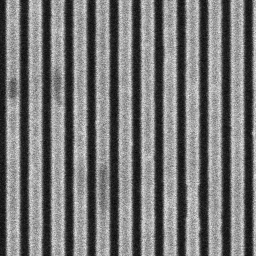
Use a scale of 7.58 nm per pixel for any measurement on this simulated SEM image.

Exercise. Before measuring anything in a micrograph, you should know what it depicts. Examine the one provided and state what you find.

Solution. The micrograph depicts parallel lines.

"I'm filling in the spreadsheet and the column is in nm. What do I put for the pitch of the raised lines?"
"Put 170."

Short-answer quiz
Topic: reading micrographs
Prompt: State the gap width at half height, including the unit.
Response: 66.3 nanometers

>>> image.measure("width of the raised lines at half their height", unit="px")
13.1